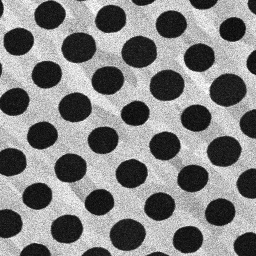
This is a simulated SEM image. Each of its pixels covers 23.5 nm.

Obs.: a regular array of holes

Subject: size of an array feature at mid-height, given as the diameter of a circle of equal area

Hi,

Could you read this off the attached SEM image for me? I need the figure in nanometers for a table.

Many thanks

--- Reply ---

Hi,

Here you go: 700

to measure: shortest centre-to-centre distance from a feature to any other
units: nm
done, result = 993